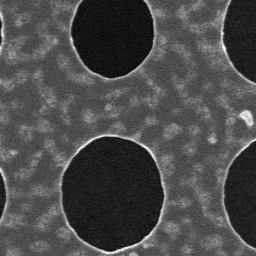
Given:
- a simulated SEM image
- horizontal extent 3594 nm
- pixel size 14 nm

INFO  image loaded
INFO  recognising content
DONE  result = holes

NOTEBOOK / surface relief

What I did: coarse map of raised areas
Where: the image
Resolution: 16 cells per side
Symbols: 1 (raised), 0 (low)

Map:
1111100001111100
1111000000111100
1111100000111100
1111100001111100
1111110011111110
1111111111111111
1111111111111111
1111111111111111
1111111111111111
1111100001111110
1111000000111100
1111000000111100
1111000000111100
1111000000111100
1111100001111110
1111110011111111